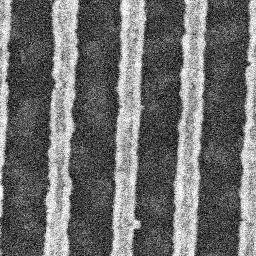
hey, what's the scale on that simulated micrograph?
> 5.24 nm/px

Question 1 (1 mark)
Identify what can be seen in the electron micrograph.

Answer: one or a few lines or trenches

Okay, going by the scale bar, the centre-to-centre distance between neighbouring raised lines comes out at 338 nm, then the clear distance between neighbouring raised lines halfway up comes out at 251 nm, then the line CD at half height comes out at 90.3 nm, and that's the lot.